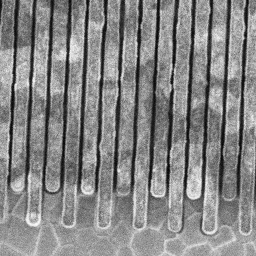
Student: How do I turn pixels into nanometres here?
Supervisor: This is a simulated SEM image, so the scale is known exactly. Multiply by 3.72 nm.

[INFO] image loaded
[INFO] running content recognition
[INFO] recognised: parallel lines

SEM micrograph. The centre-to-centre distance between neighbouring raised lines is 65.7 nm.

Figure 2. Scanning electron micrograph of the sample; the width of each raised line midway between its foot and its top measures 0.0492 micrometres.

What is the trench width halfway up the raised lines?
16.2 nm